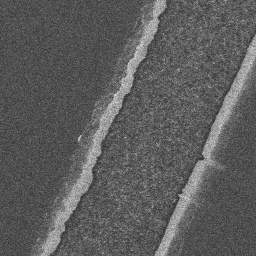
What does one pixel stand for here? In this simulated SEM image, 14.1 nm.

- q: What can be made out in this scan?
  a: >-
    one or a few lines or trenches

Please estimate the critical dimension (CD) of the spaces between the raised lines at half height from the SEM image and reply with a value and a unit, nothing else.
1450 nm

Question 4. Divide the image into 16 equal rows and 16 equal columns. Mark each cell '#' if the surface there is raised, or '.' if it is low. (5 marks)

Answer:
##########......
##########......
#########.......
#########.......
########.......#
########.......#
#######.......##
#######.......##
######.......###
######.......###
######......####
#####.......####
####.......#####
####.......#####
####.......#####
###.......######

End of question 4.